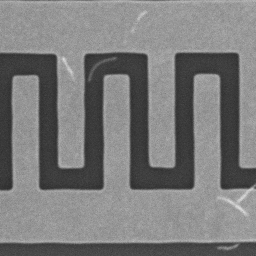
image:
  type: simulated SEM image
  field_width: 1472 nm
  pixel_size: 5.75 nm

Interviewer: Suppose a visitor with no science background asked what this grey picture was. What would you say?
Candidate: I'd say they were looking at groups of lines, slits or small figures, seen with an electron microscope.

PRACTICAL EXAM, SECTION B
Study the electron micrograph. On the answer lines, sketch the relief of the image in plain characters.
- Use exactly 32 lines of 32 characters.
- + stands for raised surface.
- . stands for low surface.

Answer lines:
++++++++++++++++++++++++++++++++
++++++++++++++++++++++++++++++++
++++++++++++++++++++++++++++++++
++++++++++++++++++++++++++++++++
++++++++++++++++++++++++++++++++
++++++++++++++++++++++++++++++++
++++++++++++++..+++++++......+++
.......+++.........+++........++
.......+++.........+++........++
..++...++++..+++...+++...++...++
..+++..++++..+++...+++..+++...++
..+++..+++...+++...+++..+++...++
..+++..+++...+++...+++..+++...++
..+++..++++..+++...+++..+++...++
..+++..++++..+++...+++..+++...++
..+++..++++..+++...+++..+++...++
..+++..+++...+++...+++..+++...++
..+++..+++...+++...+++..+++...++
..+++..+++...+++...+++..++++..++
..+++..+++...+++...+++..++++..++
..+++..+++...+++...+++..++++..++
..+++........+++........++++....
..+++........+++........+++.....
.++++........+++........++++....
++++++++++++++++++++++++++++++++
++++++++++++++++++++++++++++++++
++++++++++++++++++++++++++++++++
++++++++++++++++++++++++++++++++
++++++++++++++++++++++++++++++++
++++++++++++++++++++++++++++++++
................................
................................